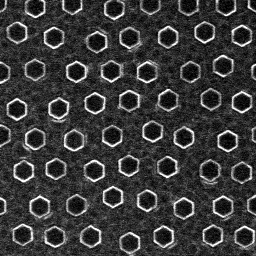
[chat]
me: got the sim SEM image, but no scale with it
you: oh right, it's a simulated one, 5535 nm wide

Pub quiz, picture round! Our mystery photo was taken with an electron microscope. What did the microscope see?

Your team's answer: a regular array of raised bodies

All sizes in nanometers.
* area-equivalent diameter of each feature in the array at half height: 445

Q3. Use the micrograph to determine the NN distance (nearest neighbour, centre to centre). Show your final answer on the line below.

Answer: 707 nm